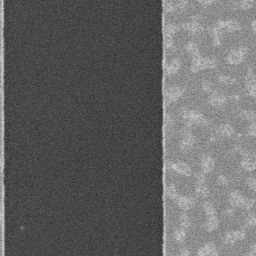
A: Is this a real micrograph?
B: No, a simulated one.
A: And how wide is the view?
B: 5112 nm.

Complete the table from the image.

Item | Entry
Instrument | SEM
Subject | one or a few lines or trenches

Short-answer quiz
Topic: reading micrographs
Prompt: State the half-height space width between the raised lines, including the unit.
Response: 161 pixels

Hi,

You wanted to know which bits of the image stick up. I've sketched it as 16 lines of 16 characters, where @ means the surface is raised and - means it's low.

----------@@@@@@
----------@@@@@@
----------@@@@@@
----------@@@@@@
----------@@@@@@
----------@@@@@@
----------@@@@@@
----------@@@@@@
----------@@@@@@
----------@@@@@@
----------@@@@@@
----------@@@@@@
----------@@@@@@
----------@@@@@@
----------@@@@@@
----------@@@@@@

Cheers